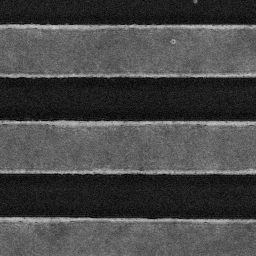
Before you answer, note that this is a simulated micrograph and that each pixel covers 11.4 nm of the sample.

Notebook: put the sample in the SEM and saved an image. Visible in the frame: lines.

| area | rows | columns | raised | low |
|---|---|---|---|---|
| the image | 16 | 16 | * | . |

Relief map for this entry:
................
................
****************
****************
****************
................
................
................
****************
****************
****************
................
................
................
****************
****************